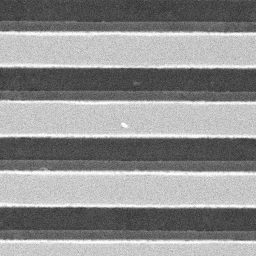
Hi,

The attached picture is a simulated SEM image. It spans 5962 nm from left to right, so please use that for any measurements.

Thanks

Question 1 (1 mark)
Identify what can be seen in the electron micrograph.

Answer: lines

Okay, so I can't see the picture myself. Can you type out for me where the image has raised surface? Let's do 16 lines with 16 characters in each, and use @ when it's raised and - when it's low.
----------------
----------------
@@@@@@@@@@@@@@@@
@@@@@@@@@@@@@@@@
----------------
----------------
@@@@@@@@@@@@@@@@
@@@@@@@@@@@@@@@@
@@@@@@@@@@@@@@@@
----------------
----------------
@@@@@@@@@@@@@@@@
@@@@@@@@@@@@@@@@
----------------
----------------
@@@@@@@@@@@@@@@@